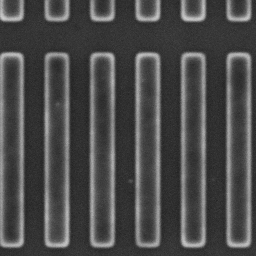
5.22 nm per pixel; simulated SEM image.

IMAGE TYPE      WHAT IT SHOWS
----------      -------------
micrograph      groups of lines, slits or small figures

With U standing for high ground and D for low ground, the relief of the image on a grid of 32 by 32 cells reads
UUUDDDUUDDDUUUDDDUUUDDDUUUDDDUUD
UUUDDDUUDDDUUUDDDUUUDDDUUUDDDUUD
DDDDDDDDDDDDDDDDDDDDDDDDDDDDDDDD
DDDDDDDDDDDDDDDDDDDDDDDDDDDDDDDD
DDDDDDDDDDDDDDDDDDDDDDDDDDDDDDDD
DDDDDDDDDDDDDDDDDDDDDDDDDDDDDDDD
DDDDDDDDDDDDDDDDDDDDDDDDDDDDDDDD
UUUDDDUUDDDUUUDDDUUUDDDUUUDDDUUD
UUUDDDUUDDDUUUDDDUUUDDDUUUDDDUUD
UUUDDDUUDDDUUUDDDUUUDDDUUUDDDUUD
UUUDDDUUDDDUUUDDDUUUDDDUUUDDDUUD
UUUDDDUUDDDUUUDDDUUUDDDUUUDDDUUD
UUUDDDUUDDDUUUDDDUUUDDDUUUDDDUUD
UUUDDDUUDDDUUUDDDUUUDDDUUUDDDUUD
UUUDDDUUDDDUUUDDDUUUDDDUUUDDDUUD
UUUDDDUUDDDUUUDDDUUUDDDUUUDDDUUD
UUUDDDUUDDDUUUDDDUUUDDDUUUDDDUUD
UUUDDDUUDDDUUUDDDUUUDDDUUUDDDUUD
UUUDDDUUDDDUUUDDDUUUDDDUUUDDDUUD
UUUDDDUUDDDUUUDDDUUUDDDUUUDDDUUD
UUUDDDUUDDDUUUDDDUUUDDDUUUDDDUUD
UUUDDDUUDDDUUUDDDUUUDDDUUUDDDUUD
UUUDDDUUDDDUUUDDDUUUDDDUUUDDDUUD
UUUDDDUUDDDUUUDDDUUUDDDUUUDDDUUD
UUUDDDUUDDDUUUDDDUUUDDDUUUDDDUUD
UUUDDDUUDDDUUUDDDUUUDDDUUUDDDUUD
UUUDDDUUDDDUUUDDDUUUDDDUUUDDDUUD
UUUDDDUUDDDUUUDDDUUUDDDUUUDDDUUD
UUUDDDUUDDDUUUDDDUUUDDDUUUDDDUUD
UUUDDDUUDDDUUUDDDUUUDDDUUUDDDUUD
UUDDDDUUDDDDUUDDDUUDDDDUUDDDDUUD
DDDDDDDDDDDDDDDDDDDDDDDDDDDDDDDD